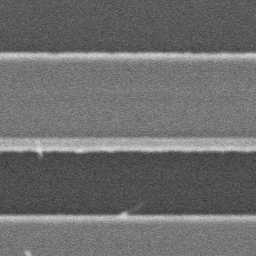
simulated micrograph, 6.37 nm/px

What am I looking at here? lines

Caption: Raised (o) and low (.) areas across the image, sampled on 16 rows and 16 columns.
................
................
................
oooooooooooooooo
oooooooooooooooo
oooooooooooooooo
oooooooooooooooo
oooooooooooooooo
oooooooooooooooo
................
................
................
................
.......o........
oooooooooooooooo
oooooooooooooooo